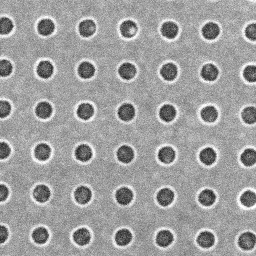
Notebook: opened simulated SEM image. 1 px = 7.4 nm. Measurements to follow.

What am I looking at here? a regular array of holes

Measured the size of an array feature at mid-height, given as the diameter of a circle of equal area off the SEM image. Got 145 nanometers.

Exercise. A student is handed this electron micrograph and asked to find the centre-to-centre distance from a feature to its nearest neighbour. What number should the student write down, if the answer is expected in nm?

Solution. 304